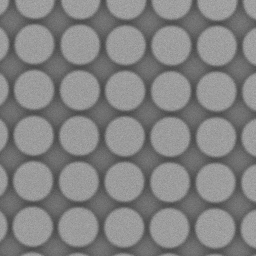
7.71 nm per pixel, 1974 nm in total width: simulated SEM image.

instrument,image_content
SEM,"an array of small figures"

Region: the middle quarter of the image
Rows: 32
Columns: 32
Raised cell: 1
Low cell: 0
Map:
00000000000000000000000000000000
00000000000000000000000000000000
01111110000001111100000001111000
11111111000011111110000111111100
11111111000111111111000111111110
11111111100111111111001111111111
11111111100111111111001111111110
11111111100111111111001111111110
11111111000111111111001111111110
11111111000111111110000111111110
01111110000011111100000111111100
00000000000000110000000000110000
00000000000000000000000000000000
00111100000000111000000000110000
11111110000011111110000011111100
11111111000111111110000111111110
11111111000111111111001111111110
11111111101111111111001111111110
11111111101111111111001111111110
11111111000111111111001111111110
11111111000111111110001111111110
01111110000011111110000111111100
00111100000001111000000011111000
00000000000000000000000000000000
00000000000000000000000000000000
01111110000011111100000011111000
11111111000111111110000111111100
11111111000111111111001111111110
11111111101111111111001111111110
11111111101111111111001111111110
11111111101111111111001111111110
11111111000111111110001111111110